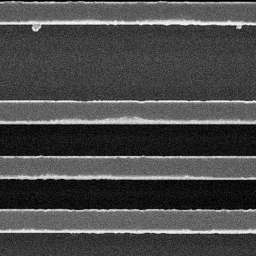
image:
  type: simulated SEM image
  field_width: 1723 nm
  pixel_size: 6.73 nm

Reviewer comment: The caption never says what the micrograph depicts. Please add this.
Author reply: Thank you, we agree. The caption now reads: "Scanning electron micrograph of lines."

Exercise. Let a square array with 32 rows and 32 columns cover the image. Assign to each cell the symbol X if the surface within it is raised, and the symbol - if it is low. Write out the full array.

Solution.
XXXXXXXXXXXXXXXXXXXXXXXXXXXXXXXX
XXXXXXXXXXXXXXXXXXXXXXXXXXXXXXXX
XXXXXXXXXXXXXXXXXXXXXXXXXXXXXXXX
--------------------------------
--------------------------------
--------------------------------
--------------------------------
--------------------------------
--------------------------------
--------------------------------
--------------------------------
--------------------------------
--------------------------------
XXXXXXXXXXXXXXXXXXXXXXXXXXXXXXXX
XXXXXXXXXXXXXXXXXXXXXXXXXXXXXXXX
--------------------------------
--------------------------------
--------------------------------
--------------------------------
--------------------------------
XXXXXXXXXXXXXXXXXXXXXXXXXXXXXXXX
XXXXXXXXXXXXXXXXXXXXXXXXXXXXXXXX
--------------------------------
--------------------------------
--------------------------------
--------------------------------
XXXXXXXXXXXXXXXXXXXXXXXXXXXXXXXX
XXXXXXXXXXXXXXXXXXXXXXXXXXXXXXXX
XXXXXXXXXXXXXXXXXXXXXXXXXXXXXXXX
--------------------------------
--------------------------------
--------------------------------